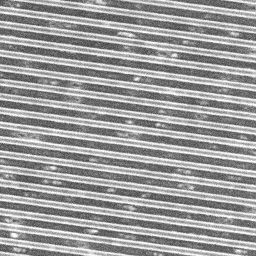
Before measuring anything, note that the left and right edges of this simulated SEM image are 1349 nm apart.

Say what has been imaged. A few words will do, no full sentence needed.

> parallel lines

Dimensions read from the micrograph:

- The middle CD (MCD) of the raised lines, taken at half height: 29.4 nanometers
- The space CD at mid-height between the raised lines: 8.29 px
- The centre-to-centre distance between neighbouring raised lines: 0.0754 micrometres